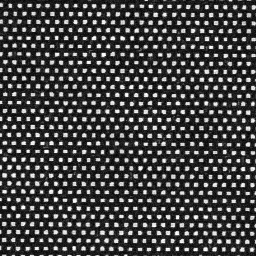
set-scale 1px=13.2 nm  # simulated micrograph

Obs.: a regular array of raised bodies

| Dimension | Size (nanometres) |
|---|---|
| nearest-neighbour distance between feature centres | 119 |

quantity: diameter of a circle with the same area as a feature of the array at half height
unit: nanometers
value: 51.8